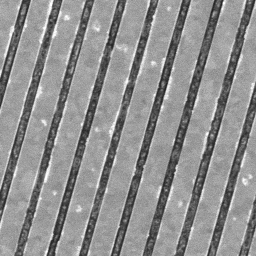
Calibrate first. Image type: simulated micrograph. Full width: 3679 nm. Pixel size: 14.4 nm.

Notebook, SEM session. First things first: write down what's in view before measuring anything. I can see parallel lines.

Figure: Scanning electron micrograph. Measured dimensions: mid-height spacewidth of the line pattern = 133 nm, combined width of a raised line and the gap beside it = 444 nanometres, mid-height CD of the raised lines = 0.318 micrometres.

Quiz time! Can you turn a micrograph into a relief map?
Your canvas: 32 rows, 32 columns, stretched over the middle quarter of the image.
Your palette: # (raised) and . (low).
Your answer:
#..######..######..######..#####
...######..######..######..#####
...#####...#####...#####...#####
..######..######..######..######
..######..######..######..######
..#####...#####...######..#####.
.######..######...#####..######.
.######..######..######..######.
.######..######..######..######.
.#####...#####...#####...#####..
######..######..######..######..
######..######..######..######..
######..#####...######..######..
#####..######...#####...#####...
#####..######..######..######..#
#####..######..######..######..#
####...#####...#####...#####...#
####..######..######..######...#
####..######..######..######..##
####..#####...######..######..##
###..######...#####...#####...##
###..######..######..######..###
###..######..######..######..###
##...#####...######..#####...###
##..######...#####..######...###
##..######..######..######..####
##..######..######..######..####
#...#####...######..#####...####
#..######..######..######..#####
#..######..######..######..#####
...#####...######..#####...#####
..######...#####..######...#####